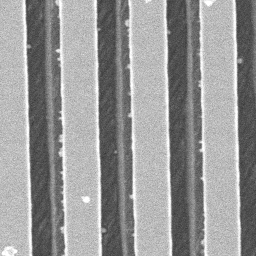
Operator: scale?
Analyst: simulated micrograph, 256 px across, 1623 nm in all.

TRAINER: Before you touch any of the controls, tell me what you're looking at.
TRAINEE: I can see lines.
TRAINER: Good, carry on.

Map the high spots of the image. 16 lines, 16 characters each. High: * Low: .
**..**..**...**.
**..**..**...**.
**..**..**...**.
**..**..**...**.
**..**..**...**.
**..**..**...**.
**..**..**...**.
**..**..**...**.
**..**..***..**.
**..**..***..**.
**..**..***..**.
**..**..***..**.
**..**..***..**.
**..**..***..**.
**..**..***..**.
**..**..***..**.